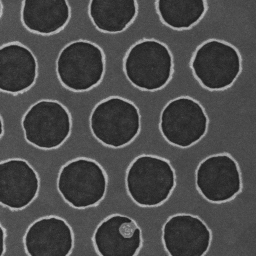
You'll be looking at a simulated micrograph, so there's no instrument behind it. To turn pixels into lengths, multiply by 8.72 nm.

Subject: a regular array of holes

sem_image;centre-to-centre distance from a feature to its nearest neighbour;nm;577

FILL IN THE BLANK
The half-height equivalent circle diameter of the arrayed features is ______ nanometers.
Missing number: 416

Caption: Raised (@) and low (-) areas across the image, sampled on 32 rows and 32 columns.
@@@-----@@@------@@@------@@@@@@
@@@------@@------@@@-----@@@@@@@
@@@-----@@@@----@@@@-----@@@@@@@
@@@@----@@@@----@@@@@@-@@@@@@@@@
@@@@@@@@@@@@@@@@@@@@@@@@@@@@@@@@
@@@@@@@@@---@@@@@---@@@@@@--@@@@
----@@@@-----@@@-----@@@@-----@@
----@@@------@@@------@@------@@
-----@@------@@@-----@@@------@@
----@@@------@@@-----@@@@-----@@
----@@@@----@@@@@----@@@@----@@@
@-@@@@@@@@@@@@@@@@@@@@@@@@@@@@@@
@@@@@@@@@@@@@--@@@@@@@--@@@@@@@@
@@@@----@@@@-----@@@@----@@@@@@@
@@@------@@------@@@------@@@@@@
@@@------@@------@@@------@@@@@@
@@@------@@@-----@@@------@@@@@@
@@@-----@@@@@---@@@@@----@@@@@@@
@@@@@-@@@@@@@@@@@@@@@@@@@@@@@@@@
@@@@@@@@@@@@@@@@@@-@@@@@@@@-@@@@
---@@@@@@---@@@@@----@@@@----@@@
----@@@@-----@@@------@@@-----@@
-----@@------@@@------@@@-----@@
-----@@------@@@------@@@-----@@
----@@@@-----@@@-----@@@@@---@@@
---@@@@@@---@@@@@---@@@@@@@@@@@@
@@@@@@@@@@@@@@@@@@@@@@@@@@@@@@@@
@@@@@---@@@@@---@@@@@----@@@@@@@
@@@@-----@@@-----@@@@-----@@@@@@
@@@------@@@------@@------@@@@@@
@@@------@@@------@@@-----@@@@@@
@@@------@@@-----@@@@-----@@@@@@